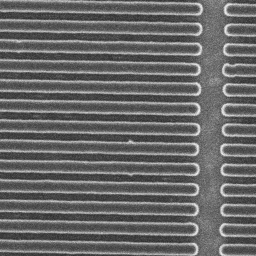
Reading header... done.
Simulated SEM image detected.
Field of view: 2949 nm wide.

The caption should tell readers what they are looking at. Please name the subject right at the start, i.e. parallel lines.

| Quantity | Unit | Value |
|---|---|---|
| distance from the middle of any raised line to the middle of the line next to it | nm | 231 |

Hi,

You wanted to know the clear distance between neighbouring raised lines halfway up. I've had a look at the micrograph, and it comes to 99.3 nm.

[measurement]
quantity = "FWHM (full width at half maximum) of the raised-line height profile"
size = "140 nm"